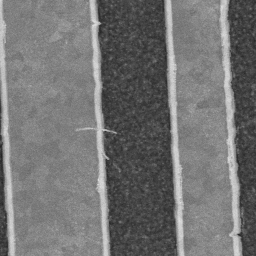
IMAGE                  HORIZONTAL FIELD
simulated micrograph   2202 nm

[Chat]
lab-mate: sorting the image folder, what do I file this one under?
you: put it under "one or a few lines or trenches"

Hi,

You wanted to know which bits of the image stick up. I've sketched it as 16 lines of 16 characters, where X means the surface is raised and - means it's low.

XXXXXX-----XXX--
XXXXXX-----XXX--
XXXXXX-----XXX--
XXXXXX-----XXX--
XXXXXX-----XXX--
XXXXXX-----XXX--
XXXXXX-----XXX--
XXXXXX-----XXX--
XXXXXX-----XXX--
XXXXXX-----XXXX-
XXXXXX-----XXXX-
-XXXXX-----XXXX-
-XXXXX-----XXXX-
-XXXXX-----XXXX-
-XXXXXX----XXXX-
-XXXXXX----XXXX-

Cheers